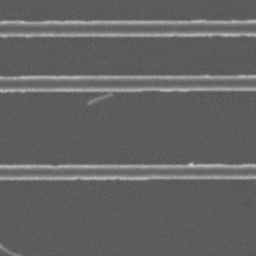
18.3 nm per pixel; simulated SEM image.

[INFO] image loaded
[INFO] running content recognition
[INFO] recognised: lines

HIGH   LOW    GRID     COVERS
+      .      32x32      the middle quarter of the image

................................
................................
................................
++++++++++++++++++++++++++++++++
++++++++++++++++++++++++++++++++
++++++++++++++++++++++++++++++++
++++++++++++++++++++....++++.++.
................................
................................
................................
................................
................................
................................
................................
................................
................................
................................
................................
................................
................................
................................
................................
................................
................................
................................
++++++++++++++++++++++++++++++++
++++++++++++++++++++++++++++++++
++++++++++++++++++++++++++++++++
++++++++++++++++++++++++++++++++
................................
................................
................................